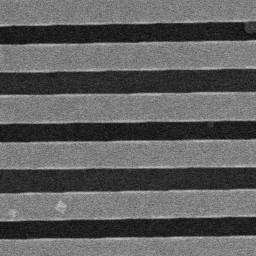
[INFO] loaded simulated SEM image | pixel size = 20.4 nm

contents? lines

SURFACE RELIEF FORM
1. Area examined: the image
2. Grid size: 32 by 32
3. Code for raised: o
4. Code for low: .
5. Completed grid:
oooooooooooooooooooooooooooooooo
oooooooooooooooooooooooooooooooo
oooooooooooooooooooooooooooooooo
................................
................................
...........ooooooooooooooooooooo
oooooooooooooooooooooooooooooooo
oooooooooooooooooooooooooooooooo
oooooooooooooooooooooooooooooooo
................................
................................
................................
oooooooooooooooooooooooooooooooo
oooooooooooooooooooooooooooooooo
oooooooooooooooooooooooooooooooo
................................
................................
...............................o
oooooooooooooooooooooooooooooooo
oooooooooooooooooooooooooooooooo
oooooooooooooooooooooooooooooooo
................................
................................
................................
oooooooooooooooooooooooooooooooo
oooooooooooooooooooooooooooooooo
oooooooooooooooooooooooooooooooo
ooo.............................
................................
................................
oooooooooooooooooooooooooooooooo
oooooooooooooooooooooooooooooooo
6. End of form